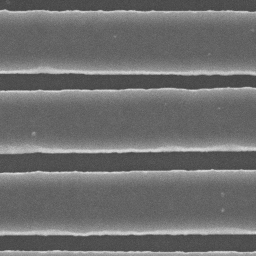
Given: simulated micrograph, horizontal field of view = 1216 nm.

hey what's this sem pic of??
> lines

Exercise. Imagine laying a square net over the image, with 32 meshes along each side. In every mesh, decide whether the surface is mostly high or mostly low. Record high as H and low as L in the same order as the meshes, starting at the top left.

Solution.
LLLLLLLLLLLLLLLLLLLLLLLLLLLLLLLL
HHHHHHHHHHHHHHHHHHHHHHHHHHHHHHHL
HHHHHHHHHHHHHHHHHHHHHHHHHHHHHHHH
HHHHHHHHHHHHHHHHHHHHHHHHHHHHHHHH
HHHHHHHHHHHHHHHHHHHHHHHHHHHHHHHH
HHHHHHHHHHHHHHHHHHHHHHHHHHHHHHHH
HHHHHHHHHHHHHHHHHHHHHHHHHHHHHHHH
HHHHHHHHHHHHHHHHHHHHHHHHHHHHHHHH
HHHHHHHHHHHHHHHHHHHHHHHHHHHHHHHH
LLLLLLLLLLLLLLLLLLLLLLLLLLLLLLLL
LLLLLLLLLLLLLLLLLLLLLLLLLLLLLLLL
HHHHHHHHHHHHHHHHHHHHHHHHHHHHHHHH
HHHHHHHHHHHHHHHHHHHHHHHHHHHHHHHH
HHHHHHHHHHHHHHHHHHHHHHHHHHHHHHHH
HHHHHHHHHHHHHHHHHHHHHHHHHHHHHHHH
HHHHHHHHHHHHHHHHHHHHHHHHHHHHHHHH
HHHHHHHHHHHHHHHHHHHHHHHHHHHHHHHH
HHHHHHHHHHHHHHHHHHHHHHHHHHHHHHHH
HHHHHHHHHHHHHHHHHHHHHHHHHHHHHHHH
LLLLLLLLLLLLLLLLLLLLLLLLLLLLLLLL
LLLLLLLLLLLLLLLLLLLLLLLLLLLLLLLL
LLLLHLLLLHLLLLLLHHHHHHHHHHHHHHHH
HHHHHHHHHHHHHHHHHHHHHHHHHHHHHHHH
HHHHHHHHHHHHHHHHHHHHHHHHHHHHHHHH
HHHHHHHHHHHHHHHHHHHHHHHHHHHHHHHH
HHHHHHHHHHHHHHHHHHHHHHHHHHHHHHHH
HHHHHHHHHHHHHHHHHHHHHHHHHHHHHHHH
HHHHHHHHHHHHHHHHHHHHHHHHHHHHHHHH
HHHHHHHHHHHHHHHHHHHHHHHHHHHHHHHH
LLLLLLLLLLLLLLLLLLLLLLLLLLLLLLLL
LLLLLLLLLLLLLLLLLLLLLLLLLLLLLLLL
HHHHHHHHHHHHHHHLHHHLLLHLLLHHHHLH